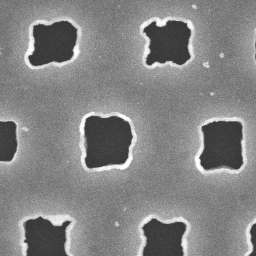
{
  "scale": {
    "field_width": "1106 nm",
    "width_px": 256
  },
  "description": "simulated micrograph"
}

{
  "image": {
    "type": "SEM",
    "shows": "holes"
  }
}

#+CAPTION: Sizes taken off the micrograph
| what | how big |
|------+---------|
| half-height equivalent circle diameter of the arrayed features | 205 nm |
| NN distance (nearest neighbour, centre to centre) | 490 nanometres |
